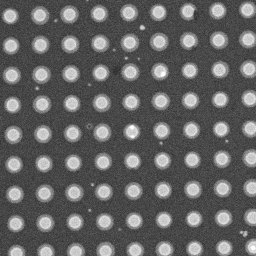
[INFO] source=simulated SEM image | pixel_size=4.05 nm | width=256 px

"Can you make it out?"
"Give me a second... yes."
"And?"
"an array of small figures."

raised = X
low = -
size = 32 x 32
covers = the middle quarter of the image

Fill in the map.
-XX-----XX-----XXX----XXXX----XX
XXXX---XXXX---XXXXX---XXXX----XX
XXXX---XXXX---XXXXX---XXXX----XX
XXXX----XXX----XXX-----XX------X
-X------------------------------
--------------------------------
--------------------------------
-----------------------XX-----XX
XXXX----XXX----XXXX---XXXX----XX
XXXX---XXXXX---XXXX---XXXX----XX
XXXX---XXXXX---XXXX---XXXX----XX
-XX-----XXX-----X---------------
--------------------------------
--------------------------------
--------------------------------
-XX-----XXX-----XXX----XXX----XX
XXXX---XXXXX---XXXX---XXXX----XX
XXXX---XXXXX---XXXX----XXX----XX
XXXX----XXX-----XX-----XX------X
--------------------------------
--------------------------------
--------------------------------
---------XX-----XX-----XXX-----X
-XXX----XXXX---XXXX----XXXX---XX
XXXX----XXXX---XXXX----XXXX---XX
XXXX----XXXX---XXXX----XXX-----X
-XX-----------------------------
--------------------------------
--------------------------------
-------------------------------X
-XXX----XXXX----XXX----XXXX---XX
XXXXX---XXXX---XXXXX---XXXX---XX